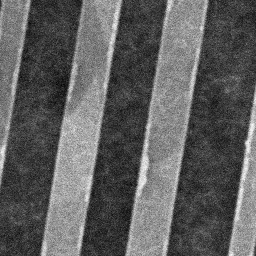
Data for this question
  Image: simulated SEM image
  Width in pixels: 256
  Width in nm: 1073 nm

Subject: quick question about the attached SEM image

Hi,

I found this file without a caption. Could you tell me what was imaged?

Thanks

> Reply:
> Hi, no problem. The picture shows one or a few lines or trenches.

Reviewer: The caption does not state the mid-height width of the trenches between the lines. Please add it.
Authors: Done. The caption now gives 52.7 pixels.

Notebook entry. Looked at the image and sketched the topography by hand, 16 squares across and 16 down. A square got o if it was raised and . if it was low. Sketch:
oo...oo...ooo...
oo...oo...ooo...
o....oo...ooo...
o....oo...oo....
o...ooo...oo....
o...ooo...oo....
o...ooo..ooo....
o...oo...ooo....
....oo...ooo...o
....oo...oo....o
...ooo...oo....o
...ooo...oo....o
...ooo..ooo....o
...oo...ooo....o
...oo...ooo....o
...oo...oo....oo